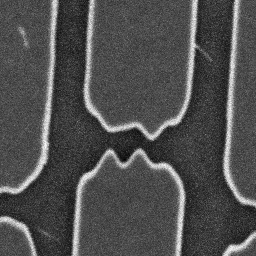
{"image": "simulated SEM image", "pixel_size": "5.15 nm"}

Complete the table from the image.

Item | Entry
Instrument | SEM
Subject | one or a few lines or trenches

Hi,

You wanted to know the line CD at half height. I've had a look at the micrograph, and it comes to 535 nanometers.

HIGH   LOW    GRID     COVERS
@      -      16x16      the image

@@@---@@@@@@---@
@@@---@@@@@@---@
@@@---@@@@@@---@
@@@---@@@@@@---@
@@@--@@@@@@@--@@
@@@--@@@@@@@--@@
@@@---@@@@@@--@@
@@@---@@@@@---@@
@@@-----------@@
@@@-----------@@
@@----@@@@@---@@
@@---@@@@@@---@@
-----@@@@@@----@
-----@@@@@@-----
@@---@@@@@@-----
@@---@@@@@@----@